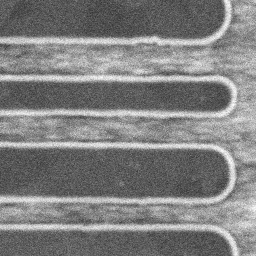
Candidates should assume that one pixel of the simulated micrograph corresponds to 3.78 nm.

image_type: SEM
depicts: one or a few lines or trenches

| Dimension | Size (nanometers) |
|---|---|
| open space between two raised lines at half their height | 118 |